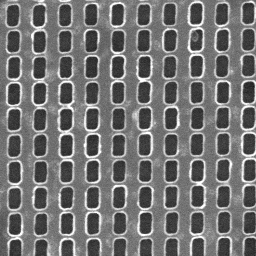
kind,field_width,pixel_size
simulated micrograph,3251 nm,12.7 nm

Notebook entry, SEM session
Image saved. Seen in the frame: a regular array of holes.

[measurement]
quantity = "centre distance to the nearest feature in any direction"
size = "0.327 um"